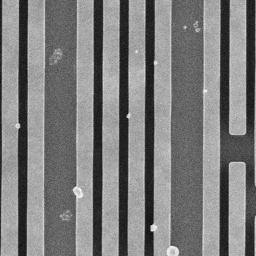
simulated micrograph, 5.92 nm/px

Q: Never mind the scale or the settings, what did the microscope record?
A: groups of lines, slits or small figures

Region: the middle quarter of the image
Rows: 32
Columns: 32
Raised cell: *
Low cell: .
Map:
...****...****..****...****.....
...****...****..****...****.....
...****...****..****...****.....
...****...****..****...****.....
...****...****..****...****.....
...****...****..****...****.....
...****...****..****...****.....
...****...****..****...****.....
...****...****..****...****.....
...****...****..****...****.....
...****...****..****...****.....
...****...****..****...****.....
...****...****..****...****.....
...****...****..****...****.....
...****...****..****...***......
...****...****..****...***......
...****...****..****...***......
...****...****..****...***......
...****...****..****...***......
...****...****..****...***......
...****...****..****...***......
...****...****..****...***......
...****...****..****...****.....
...****...****..****...****.....
...****...****..****...****.....
...****...****..****...****.....
...****...****..****...****.....
...****...****..****...***......
...****...****..****...***......
...****...****..****...***......
...****...****..****...***......
..*****...****..****...***......